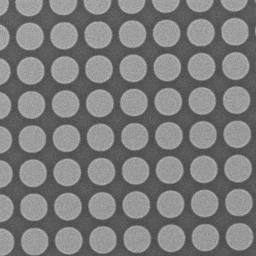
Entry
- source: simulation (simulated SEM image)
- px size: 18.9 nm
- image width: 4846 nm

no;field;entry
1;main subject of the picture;an array of small figures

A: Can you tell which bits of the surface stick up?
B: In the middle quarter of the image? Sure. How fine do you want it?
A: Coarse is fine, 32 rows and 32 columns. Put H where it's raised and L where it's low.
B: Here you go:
HHHLLLHHHHHHLLHHHHHHLLLHHHHHHLLH
HHHLLLHHHHHHLLHHHHHHHLLHHHHHHLLH
HHHLLLHHHHHHLLHHHHHHLLLHHHHHHLLL
HHHLLLHHHHHLLLLHHHHHLLLLHHHHLLLL
HHLLLLLLHHLLLLLLLLLLLLLLLLLLLLLL
LLLLLLLLLLLLLLLLLLLLLLLLLLLLLLLL
LLLLLLLLLLLLLLLLHHHLLLLLLHHLLLLL
HHHLLLLHHHHLLLLHHHHHLLLHHHHHHLLL
HHHLLLHHHHHHLLHHHHHHHLLHHHHHHLLH
HHHHLLHHHHHHLLHHHHHHHLLHHHHHHLLH
HHHHLLHHHHHHLLHHHHHHHLLHHHHHHLLH
HHHLLLHHHHHHLLLHHHHHLLLHHHHHHLLL
HHHLLLLHHHHLLLLLHHHLLLLLLHHLLLLL
LLLLLLLLLLLLLLLLLLLLLLLLLLLLLLLL
LLLLLLLLLLLLLLLLLLLLLLLLLLLLLLLL
HHLLLLLHHHHLLLLLHHHHLLLLHHHHHLLL
HHHLLLHHHHHHLLLHHHHHHLLHHHHHHLLL
HHHHLLHHHHHHLLLHHHHHHLLHHHHHHLLL
HHHHLLHHHHHHLLLHHHHHHLLHHHHHHLLL
HHHHLLHHHHHHLLLHHHHHHLLHHHHHHLLL
HHHLLLLHHHHHLLLHHHHHLLLLHHHHLLLL
HHLLLLLLHHLLLLLLLLLLLLLLLLLLLLLL
LLLLLLLLLLLLLLLLLLLLLLLLLLLLLLLL
LLLLLLLLLLLLLLLLLHHLLLLLLHHHLLLL
HHHLLLLHHHHHLLLHHHHHLLLLHHHHHLLL
HHHHLLHHHHHHLLLHHHHHHLLHHHHHHHLL
HHHHLLHHHHHHHLLHHHHHHLLHHHHHHHLL
HHHHLLHHHHHHHLLHHHHHHLLHHHHHHHLL
HHHHLLHHHHHHLLLHHHHHHLLLHHHHHLLL
HHHLLLLHHHHLLLLLHHHHLLLLLHHHLLLL
LLLLLLLLLLLLLLLLLLLLLLLLLLLLLLLL
LLLLLLLLLLLLLLLLLLLLLLLLLLLLLLLL